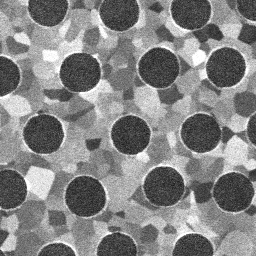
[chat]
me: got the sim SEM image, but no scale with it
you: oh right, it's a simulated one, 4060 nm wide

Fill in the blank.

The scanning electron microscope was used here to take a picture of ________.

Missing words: a regular array of holes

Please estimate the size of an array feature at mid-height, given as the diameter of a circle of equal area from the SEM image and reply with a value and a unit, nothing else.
656 nm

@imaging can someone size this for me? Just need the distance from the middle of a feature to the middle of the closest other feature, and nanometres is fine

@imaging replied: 1060